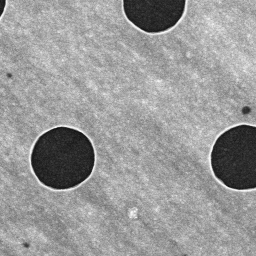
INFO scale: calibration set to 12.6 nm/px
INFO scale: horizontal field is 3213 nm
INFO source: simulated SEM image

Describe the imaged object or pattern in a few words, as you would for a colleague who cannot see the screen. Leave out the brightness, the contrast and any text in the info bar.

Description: holes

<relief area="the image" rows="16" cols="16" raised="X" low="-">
XXXXXXXX----XXXX
XXXXXXXX---XXXXX
XXXXXXXXXXXXXXXX
XXXXXXXXXXXXXXXX
XXXXXXXXXXXXXXXX
XXXXXXXXXXXXXXXX
XXXXXXXXXXXXXXXX
XXXXXXXXXXXXXXXX
XXX--XXXXXXXXX--
XX----XXXXXXX---
XX----XXXXXXX---
XXX--XXXXXXXXX--
XXXXXXXXXXXXXXXX
XXXXXXXXXXXXXXXX
XXXXXXXXXXXXXXXX
XXXXXXXXXXXXXXXX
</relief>